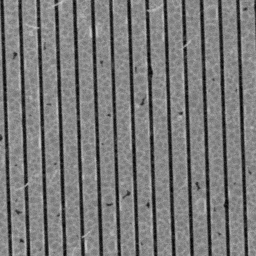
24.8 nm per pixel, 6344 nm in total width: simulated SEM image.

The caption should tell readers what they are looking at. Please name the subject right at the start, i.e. parallel lines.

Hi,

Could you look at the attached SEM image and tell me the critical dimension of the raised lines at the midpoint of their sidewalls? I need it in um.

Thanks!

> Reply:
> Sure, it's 0.344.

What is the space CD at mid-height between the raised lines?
4.25 pixels